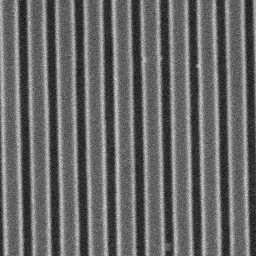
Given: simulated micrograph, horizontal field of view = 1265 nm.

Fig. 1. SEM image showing parallel lines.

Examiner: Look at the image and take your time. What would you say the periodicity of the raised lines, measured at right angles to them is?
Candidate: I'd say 140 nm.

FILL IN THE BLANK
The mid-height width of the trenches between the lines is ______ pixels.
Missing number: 11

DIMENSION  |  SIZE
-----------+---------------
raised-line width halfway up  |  18 pixels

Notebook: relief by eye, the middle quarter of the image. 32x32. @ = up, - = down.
@@@---@@@@---@@@@---@@@@---@@@@-
@@@---@@@@---@@@@---@@@@---@@@@-
@@@---@@@@---@@@@---@@@@---@@@@-
@@@---@@@@---@@@@---@@@@---@@@@-
@@@---@@@@---@@@@---@@@@---@@@@-
@@@---@@@@---@@@@---@@@@---@@@@-
@@@---@@@@---@@@@---@@@@---@@@@-
@@@---@@@@---@@@@---@@@@---@@@@-
@@@---@@@@---@@@@---@@@@---@@@@-
@@@---@@@@---@@@@---@@@@---@@@@-
@@@---@@@@---@@@@---@@@@---@@@@-
@@@---@@@@---@@@@---@@@@---@@@@-
@@@---@@@@---@@@@---@@@@---@@@@-
@@@---@@@@---@@@@---@@@@---@@@@-
@@@---@@@@---@@@@---@@@@---@@@@-
@@@---@@@@---@@@@---@@@@---@@@@-
@@@---@@@@---@@@@---@@@@---@@@@-
@@@---@@@@---@@@@---@@@@---@@@@-
@@@---@@@@---@@@@---@@@@---@@@@-
@@@---@@@@---@@@@---@@@@---@@@@@
@@@---@@@@---@@@@---@@@@---@@@@@
@@@---@@@@---@@@@---@@@@---@@@@@
@@@---@@@@---@@@@---@@@@---@@@@@
@@@---@@@@---@@@@---@@@@---@@@@@
@@@---@@@@---@@@@---@@@@---@@@@@
@@@---@@@@---@@@@---@@@@---@@@@@
@@@---@@@@---@@@@---@@@@---@@@@-
@@@---@@@@---@@@@---@@@@---@@@@-
@@@---@@@@---@@@@---@@@@---@@@@-
@@@---@@@@---@@@@---@@@@---@@@@-
@@@---@@@@---@@@@---@@@@---@@@@-
@@@---@@@@---@@@@@--@@@@@--@@@@@